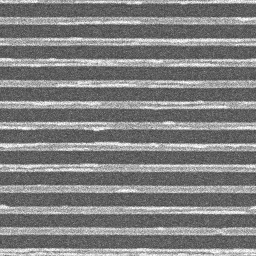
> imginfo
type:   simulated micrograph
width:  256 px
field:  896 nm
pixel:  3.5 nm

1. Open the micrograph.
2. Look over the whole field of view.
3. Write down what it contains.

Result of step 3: parallel lines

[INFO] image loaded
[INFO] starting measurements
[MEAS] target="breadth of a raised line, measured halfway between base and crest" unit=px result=6.89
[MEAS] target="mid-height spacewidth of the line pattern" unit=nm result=48.6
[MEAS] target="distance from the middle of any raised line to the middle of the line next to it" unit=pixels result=21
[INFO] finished